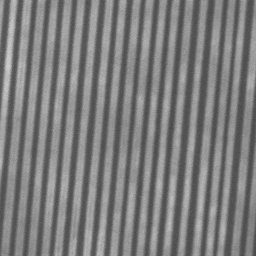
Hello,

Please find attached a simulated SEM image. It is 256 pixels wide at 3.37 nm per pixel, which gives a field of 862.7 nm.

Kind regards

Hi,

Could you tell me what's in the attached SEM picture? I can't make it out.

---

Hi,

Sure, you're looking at parallel lines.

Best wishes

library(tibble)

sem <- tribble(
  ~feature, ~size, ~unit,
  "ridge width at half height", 23.1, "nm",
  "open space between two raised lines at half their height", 23.1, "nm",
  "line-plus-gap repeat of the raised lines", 45.5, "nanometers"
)